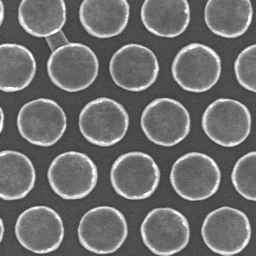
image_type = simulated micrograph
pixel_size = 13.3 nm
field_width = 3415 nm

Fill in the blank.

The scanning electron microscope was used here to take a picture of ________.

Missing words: a regular array of raised bodies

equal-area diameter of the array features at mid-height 0.625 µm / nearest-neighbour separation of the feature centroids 816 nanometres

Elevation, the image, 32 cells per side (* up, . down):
...*****..******..*****...*****.
..******..******..******..*****.
...*****..******..******..*****.
...*****...****...*****...*****.
.....*......*.......**......*...
................................
****...*****...****....****...**
****..******..******..*****...**
****..******..******..*****..***
****..******..*****...*****...**
***....****....****...*****...**
................................
.....*.......*......**.....**...
...****....****...*****...*****.
..******..******..******.******.
..******..******..******.******.
...*****..******..*****...*****.
....***....****....****....***..
................................
***....***.....****....***.....*
****..******..*****...*****...**
****..******..******..*****..***
****..******..******.******..***
****...****...*****...*****...**
***.....**.....***.....***....**
................................
...****....****....***.....***..
..******..*****...*****...*****.
..******..******..******.******.
..******..******..******.******.
...****...*****...*****...*****.
....**......*......***.....***..